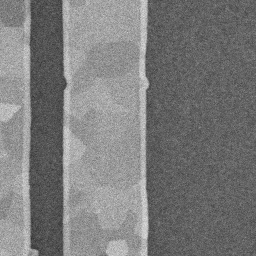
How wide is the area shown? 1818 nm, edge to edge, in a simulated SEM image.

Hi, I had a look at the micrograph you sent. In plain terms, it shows one or a few lines or trenches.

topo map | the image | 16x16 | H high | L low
HHLLHHHHHLLLLLLL
HHLLHHHHHLLLLLLL
HHLLHHHHHLLLLLLL
HHLLHHHHHLLLLLLL
HHLLHHHHHLLLLLLL
HHLLHHHHHLLLLLLL
HHLLHHHHHLLLLLLL
HHLLHHHHHLLLLLLL
HHLLHHHHHLLLLLLL
HHLLHHHHHLLLLLLL
HHLLHHHHHLLLLLLL
HHLLHHHHHLLLLLLL
HHLLHHHHHLLLLLLL
HHLLHHHHHLLLLLLL
HHLLHHHHHLLLLLLL
HHLLHHHHHLLLLLLL